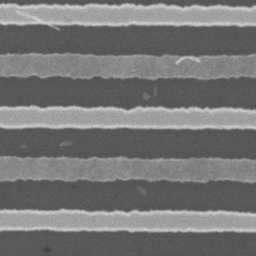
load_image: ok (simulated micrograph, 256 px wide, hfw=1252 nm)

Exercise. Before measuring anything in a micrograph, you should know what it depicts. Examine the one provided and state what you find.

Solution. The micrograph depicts lines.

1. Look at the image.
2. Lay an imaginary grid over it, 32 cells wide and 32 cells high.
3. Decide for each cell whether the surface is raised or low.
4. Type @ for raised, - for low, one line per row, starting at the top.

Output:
--------------------------------
@@@@@@@@@@@@@@@@@@@@@@@@@@@@@@@@
@@@@@@@@@@@@@@@@@@@@@@@@@@@@@@@@
--------------------------------
--------------------------------
--------------------------------
--------------------------------
@@@@@@@@@@@@@@@@@@@@@@@@@@@@@@@@
@@@@@@@@@@@@@@@@@@@@@@@@@@@@@@@@
@-@@-@--@@@@@@@@@@@@@@@@@@@@@@@@
--------------------------------
--------------------------------
--------------------------------
@@@@@-@@@@--@@---@@@----@-------
@@@@@@@@@@@@@@@@@@@@@@@@@@@@@@@@
@@@@@@@@@@@@@@@@@@@@@@@@@@@@@@@@
--------------------------------
--------------------------------
--------------------------------
--------------------------------
@@@@@@@@@@@@@@@@@@@@@@@@@@@@@@@@
@@@@@@@@@@@@@@@@@@@@@@@@@@@@@@@@
@@------@@-@@@----@@-@@@@@---@@@
--------------------------------
--------------------------------
--------------------------------
@@@@@@@@@@@---@-@--@@@@----@----
@@@@@@@@@@@@@@@@@@@@@@@@@@@@@@@@
@@@@@@@@@@@@@@@@@@@@@@@@@@@@@@@@
--------------------------------
--------------------------------
--------------------------------